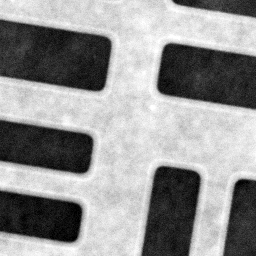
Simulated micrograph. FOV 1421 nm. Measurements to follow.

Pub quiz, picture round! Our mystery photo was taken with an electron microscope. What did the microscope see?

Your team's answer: groups of lines, slits or small figures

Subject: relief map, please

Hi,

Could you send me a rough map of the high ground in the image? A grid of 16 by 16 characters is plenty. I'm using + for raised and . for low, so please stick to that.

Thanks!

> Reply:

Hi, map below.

+++++++++++.....
...+++++++++++++
.......+++++++++
.......+++......
.......+++......
+++....+++......
+++++++++++++...
.+++++++++++++++
......++++++++++
......++++++++++
+.....++++..++++
+++++++++....++.
.....++++....+..
.....++++...++..
.....++++...++..
+++++++++...++..